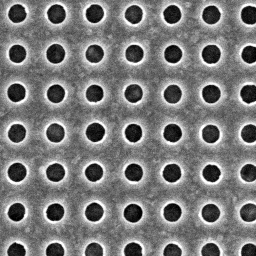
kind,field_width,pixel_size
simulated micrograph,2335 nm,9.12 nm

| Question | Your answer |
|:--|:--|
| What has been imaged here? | a regular array of holes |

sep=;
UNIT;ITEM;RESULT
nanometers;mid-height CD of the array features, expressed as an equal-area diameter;174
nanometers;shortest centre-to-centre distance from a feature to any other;351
